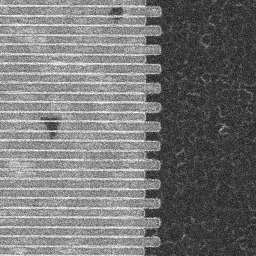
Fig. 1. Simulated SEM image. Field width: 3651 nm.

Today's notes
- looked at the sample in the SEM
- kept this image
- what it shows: parallel lines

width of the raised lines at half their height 14.3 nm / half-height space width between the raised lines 119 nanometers